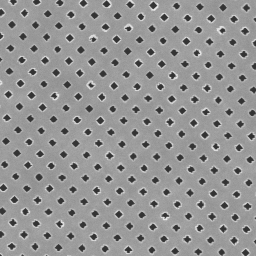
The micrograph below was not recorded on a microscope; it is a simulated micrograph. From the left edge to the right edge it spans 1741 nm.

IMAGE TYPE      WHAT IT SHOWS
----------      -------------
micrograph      a regular array of holes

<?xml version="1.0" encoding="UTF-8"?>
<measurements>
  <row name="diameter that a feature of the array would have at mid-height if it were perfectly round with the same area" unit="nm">40.6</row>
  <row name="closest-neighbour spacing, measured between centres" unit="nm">110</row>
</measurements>